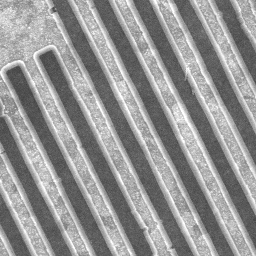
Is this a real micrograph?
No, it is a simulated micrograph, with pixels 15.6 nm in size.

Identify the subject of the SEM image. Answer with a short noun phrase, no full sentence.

parallel lines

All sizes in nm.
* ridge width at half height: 262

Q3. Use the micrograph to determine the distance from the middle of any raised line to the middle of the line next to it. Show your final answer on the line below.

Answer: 569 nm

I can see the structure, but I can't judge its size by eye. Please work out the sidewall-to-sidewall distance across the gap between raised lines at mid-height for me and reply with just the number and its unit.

298 nm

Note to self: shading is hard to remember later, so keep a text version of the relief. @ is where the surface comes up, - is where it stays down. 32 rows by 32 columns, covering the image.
@@@@@@---@@---@@---@@@--@@@--@@@
@@@@@@@---@@---@@---@@---@@---@@
@@@@@@@---@@---@@---@@---@@@--@@
@@@@@@@@--@@@---@@---@@---@@---@
@@@@@@@@---@@---@@---@@@--@@@--@
@@@@@@@@@---@@---@@---@@---@@---
@@@@@--@@---@@---@@---@@@--@@@--
@@@@@--@@@---@@---@@---@@---@@--
@--@@---@@---@@---@@---@@---@@--
@--@@@--@@@---@@---@@---@@---@@-
@---@@---@@---@@---@@---@@---@@-
@@--@@@--@@@---@@---@@---@@---@@
@@---@@---@@---@@---@@---@@---@@
@@@--@@@--@@@---@@---@@---@@---@
-@@---@@---@@---@@---@@---@@---@
-@@@--@@@--@@@---@@---@@---@@---
--@@---@@---@@---@@---@@---@@---
--@@@--@@@--@@@---@@--@@@---@@--
---@@---@@---@@---@@---@@---@@--
---@@@--@@@--@@@---@@--@@@---@@-
@---@@---@@---@@---@@---@@---@@-
@@--@@@--@@@--@@@--@@@---@@---@@
@@---@@---@@---@@---@@---@@---@@
@@@--@@@--@@@--@@@--@@@--@@@---@
-@@---@@---@@---@@---@@---@@---@
-@@---@@---@@@--@@@--@@@--@@@---
--@@---@@---@@---@@---@@---@@---
--@@---@@---@@@--@@@--@@@--@@@--
---@@---@@---@@---@@---@@---@@--
---@@---@@---@@---@@@--@@@--@@@-
@---@@---@@---@@---@@---@@---@@-
@---@@---@@---@@@--@@@--@@@--@@@